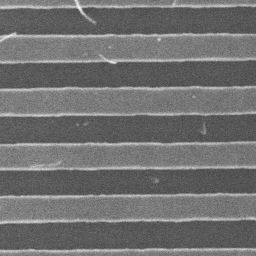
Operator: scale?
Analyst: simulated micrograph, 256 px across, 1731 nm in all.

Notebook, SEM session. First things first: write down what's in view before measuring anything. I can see lines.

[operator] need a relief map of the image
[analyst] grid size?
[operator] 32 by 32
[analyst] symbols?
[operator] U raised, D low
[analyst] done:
UUUUUUUUUUUUUUUUUUUUUUUUUUUUUUUU
DDDDDDDDDDDDDDDDDDDDDDDDDDDDDDDD
DDDDDDDDDDDDDDDDDDDDDDDDDDDDDDDD
DDDDDDDDDDDDDDDDDDDDDDDDDDDDDDDD
DUUUUUUUUUUUUUUUUUUUUUUUUUUUUUUU
UUUUUUUUUUUUUUUUUUUUUUUUUUUUUUUU
UUUUUUUUUUUUUUUUUUUUUUUUUUUUUUUU
UUUUUUUUUUUUUUUUUUUUUUUUUUDDUUDD
DDDDDDDDDDDDDDDDDDDDDDDDDDDDDDDD
DDDDDDDDDDDDDDDDDDDDDDDDDDDDDDDD
DDDDDDDDDDDDDDDDDDDDDDDDDDDDDDDD
UUUUUUUUUUUUUUUUUUUUUUUUUUUUUUUU
UUUUUUUUUUUUUUUUUUUUUUUUUUUUUUUU
UUUUUUUUUUUUUUUUUUUUUUUUUUUUUUUU
DDDDDDDDDDDDDDDDDDDDDDDDDDDDDDDD
DDDDDDDDDDDDDDDDDDDDDDDDDDDDDDDD
DDDDDDDDDDDDDDDDDDDDDDDDDDDDDDDD
DDDDDDDDDDDDDDDDDDDDDDDDDDDDDDDD
UUUUUUUUUUUUUUUUUUUUUUUUUUUUUUUU
UUUUUUUUUUUUUUUUUUUUUUUUUUUUUUUU
UUUUUUUUUUUUUUUUUUUUUUUUUUUUUUUU
DDDDDDDDDDDDDDDDDDDDDDDDDDDDDDDD
DDDDDDDDDDDDDDDDDDDDDDDDDDDDDDDD
DDDDDDDDDDDDDDDDDDDDDDDDDDDDDDDD
DUDUUUUUUUUUUUUUUUUUUUUUUUUUUUUU
UUUUUUUUUUUUUUUUUUUUUUUUUUUUUUUU
UUUUUUUUUUUUUUUUUUUUUUUUUUUUUUUU
UUUUUUUUUUUUUUUUUUUUUUUUUDUUUUDD
DDDDDDDDDDDDDDDDDDDDDDDDDDDDDDDD
DDDDDDDDDDDDDDDDDDDDDDDDDDDDDDDD
DDDDDDDDDDDDDDDDDDDDDDDDDDDDDDDD
UUUUUUUUUUUUUUUUUUUUUUUUUUUUUUUU